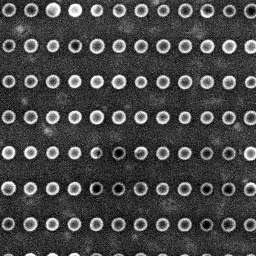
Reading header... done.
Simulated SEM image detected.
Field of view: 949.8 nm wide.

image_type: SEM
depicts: a regular array of raised bodies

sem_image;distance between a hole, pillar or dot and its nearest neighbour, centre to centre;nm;81.6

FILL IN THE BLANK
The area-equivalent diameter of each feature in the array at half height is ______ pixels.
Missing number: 12.5